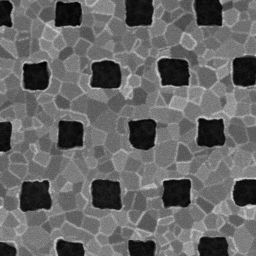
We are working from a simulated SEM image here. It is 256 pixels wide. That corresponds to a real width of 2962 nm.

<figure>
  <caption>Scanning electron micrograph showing a regular array of holes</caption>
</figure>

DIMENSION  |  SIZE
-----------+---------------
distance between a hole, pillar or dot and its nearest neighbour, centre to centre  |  0.789 microns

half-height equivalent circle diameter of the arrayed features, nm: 355